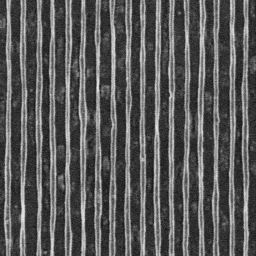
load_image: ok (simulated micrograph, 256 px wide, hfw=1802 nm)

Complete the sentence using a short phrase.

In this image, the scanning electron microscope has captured parallel lines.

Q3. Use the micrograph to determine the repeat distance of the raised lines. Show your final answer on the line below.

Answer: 14.8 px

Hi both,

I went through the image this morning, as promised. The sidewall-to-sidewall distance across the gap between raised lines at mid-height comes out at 74.8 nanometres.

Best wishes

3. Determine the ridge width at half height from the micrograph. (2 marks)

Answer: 30.8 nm